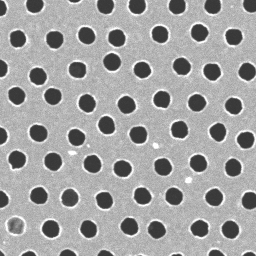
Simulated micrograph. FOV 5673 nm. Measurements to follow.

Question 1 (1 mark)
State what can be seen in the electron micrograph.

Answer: a regular array of holes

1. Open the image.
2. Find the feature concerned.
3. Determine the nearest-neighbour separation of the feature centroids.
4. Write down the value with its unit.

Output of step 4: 687 nm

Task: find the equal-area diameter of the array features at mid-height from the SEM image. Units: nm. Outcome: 393